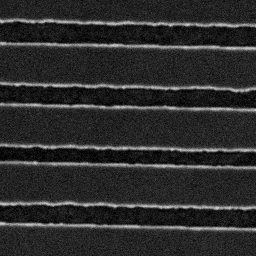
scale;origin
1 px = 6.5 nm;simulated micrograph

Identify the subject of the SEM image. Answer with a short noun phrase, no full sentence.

lines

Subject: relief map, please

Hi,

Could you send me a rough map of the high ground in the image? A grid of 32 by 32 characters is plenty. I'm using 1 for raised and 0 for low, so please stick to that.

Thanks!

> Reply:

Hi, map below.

11111111111111111111111111111111
11111111111111111111111111111111
11111111111111111111111111111111
00000000000000000000000000000000
00000000000000000000000000000000
11111110000000000000000000000000
11111111111111111111111111111111
11111111111111111111111111111111
11111111111111111111111111111111
11111111111111111111111111111111
11111111111111111111111111111111
00000000000000000000000000000000
00000000000000000000000000000000
11111111111111111111110000000000
11111111111111111111111111111111
11111111111111111111111111111111
11111111111111111111111111111111
11111111111111111111111111111111
00000111011111111111111111111111
00000000000000000000000000000000
11111111111000000000000000000000
11111111111111111111111111111111
11111111111111111111111111111111
11111111111111111111111111111111
11111111111111111111111111111111
11010011011111111111111111111111
00000000000000000000000000000000
00000000000000000000000000000000
11111111111111111111111111111000
11111111111111111111111111111111
11111111111111111111111111111111
11111111111111111111111111111111